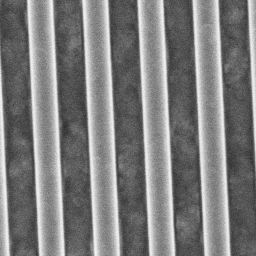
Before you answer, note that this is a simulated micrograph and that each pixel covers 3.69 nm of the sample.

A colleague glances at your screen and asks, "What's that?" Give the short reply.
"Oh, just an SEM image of parallel lines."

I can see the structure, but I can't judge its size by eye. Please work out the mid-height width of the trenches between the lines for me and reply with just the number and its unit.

113 nm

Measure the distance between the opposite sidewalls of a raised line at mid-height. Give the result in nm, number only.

92.6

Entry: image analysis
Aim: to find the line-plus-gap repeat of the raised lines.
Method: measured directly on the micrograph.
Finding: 204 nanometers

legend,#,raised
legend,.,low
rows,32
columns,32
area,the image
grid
....###...###....###....###....#
....###...###....###....###....#
....###...####...###....###....#
....###....###....##....###....#
....###....###....##....###....#
....###....###....###...###....#
....###....###....###....##....#
....###....###....###....###...#
....###....###....###....###...#
....###....###....###....###....
....###....###....###....###....
....###....###....###....###....
....###....###....###....###....
....###....###....###....###....
....###....###....###....###....
....###....###....###....###....
....###....###....###....###....
....###....###....###....###....
....###....###....###....###....
....###....###....###....###....
#...###....###....###....###....
#...####...###....###....###....
#....###...###....###....###....
#....###...####...###....###....
#....###....###...###....###....
#....###....###...###....###....
#....###....###...####...###....
#....###....###....###....##....
#....###....###....###....##....
#....###....###....###....###...
#....###....###....###....###...
#....###....###....###....###...